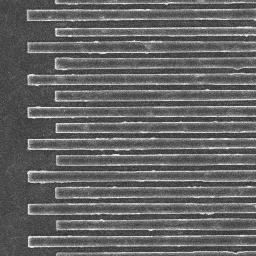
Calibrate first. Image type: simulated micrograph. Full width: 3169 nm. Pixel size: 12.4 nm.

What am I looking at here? parallel lines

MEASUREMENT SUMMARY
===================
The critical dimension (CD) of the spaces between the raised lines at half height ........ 0.0742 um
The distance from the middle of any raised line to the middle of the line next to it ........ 200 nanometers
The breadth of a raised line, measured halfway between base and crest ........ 0.127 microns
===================